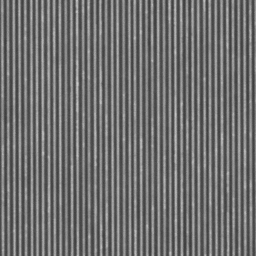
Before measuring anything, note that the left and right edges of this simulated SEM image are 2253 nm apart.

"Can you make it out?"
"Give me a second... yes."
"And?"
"parallel lines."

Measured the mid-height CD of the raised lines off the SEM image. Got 16.5 nm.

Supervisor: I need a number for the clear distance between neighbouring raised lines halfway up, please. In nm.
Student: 33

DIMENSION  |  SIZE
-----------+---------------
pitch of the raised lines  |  50.7 nanometres